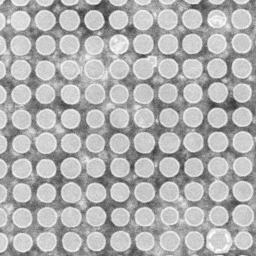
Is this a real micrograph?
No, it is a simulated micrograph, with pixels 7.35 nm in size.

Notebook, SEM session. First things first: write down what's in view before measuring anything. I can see a regular array of raised bodies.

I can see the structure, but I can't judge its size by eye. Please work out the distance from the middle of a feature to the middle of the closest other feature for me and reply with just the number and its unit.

178 nm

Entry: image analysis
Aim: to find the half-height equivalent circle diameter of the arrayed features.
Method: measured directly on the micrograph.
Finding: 140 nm